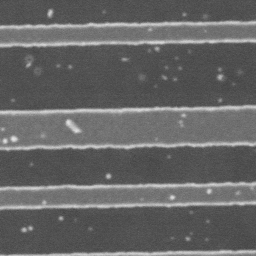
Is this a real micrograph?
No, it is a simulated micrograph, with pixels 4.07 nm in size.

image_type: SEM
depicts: lines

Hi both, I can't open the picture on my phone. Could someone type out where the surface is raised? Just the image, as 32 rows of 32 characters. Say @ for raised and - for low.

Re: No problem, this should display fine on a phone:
--------------------------------
--------------------------------
--------------------------------
@@@@@@@@@@@@@@@@@@@@@@@@@@@@@@@@
@@@@@@@@@@@@@@@@@@@@@@@@@@@@@@@@
@@@@@@@@@@@@----@---------------
--------------------------------
--------------------------------
--------------------------------
--------------------------------
--------------------------------
--------------------------------
--------------------------------
-------------------@@@@@@@@@@@@@
@@@@@@@@@@@@@@@@@@@@@@@@@@@@@@@@
@@@@@@@@@@@@@@@@@@@@@@@@@@@@@@@@
@@@@@@@@@@@@@@@@@@@@@@@@@@@@@@@@
@@@@@@@@@@@@@@@@@@@@@@@@@@@@@@@@
@@@@@@@@-@@-@--@----------------
--------------------------------
--------------------------------
--------------------------------
--------------------------------
@@@@@@@@@@@@@@@@@@@@@@@@@@@@@@@@
@@@@@@@@@@@@@@@@@@@@@@@@@@@@@@@@
@@@@@@@@@@@@@@@@@@@@@@@@@@@@@-@-
--------------------------------
--------------------------------
--------------------------------
--------------------------------
--------------------------------
----------------------------@-@@